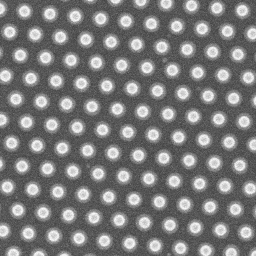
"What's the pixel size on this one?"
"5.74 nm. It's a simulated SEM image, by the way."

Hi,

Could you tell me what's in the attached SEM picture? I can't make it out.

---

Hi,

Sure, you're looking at an array of small figures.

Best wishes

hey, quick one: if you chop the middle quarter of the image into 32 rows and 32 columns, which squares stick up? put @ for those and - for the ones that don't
@@@---@@@@--@@@@@--@@@@--@@@@---
-------@@----@@@---@@@@--@@@@--@
-------------------@@@---@@@@--@
---@@@----@---------------@@----
--@@@@---@@@----@@--------------
--@@@@---@@@@--@@@@---@@@----@@-
---@@@---@@@---@@@@--@@@@---@@@@
----------@-----@@@--@@@@---@@@@
@@--------------------@@@---@@@-
@@@--@@@@---@@------------------
@@@--@@@@--@@@@---@@@-----------
@@---@@@@--@@@@---@@@@--@@@@---@
------@@----@@@---@@@@--@@@@--@@
------------------@@@---@@@@--@@
--@@@----@---------------@@----@
-@@@@---@@@----@@---------------
-@@@@---@@@@--@@@@---@@@----@---
--@@@---@@@---@@@@--@@@@---@@@@-
--------------@@@@--@@@@---@@@@-
@--------------------@@----@@@--
@@--@@@@---@@-------------------
@@--@@@@--@@@@---@@@----@-------
@---@@@@--@@@@---@@@@--@@@@---@@
-----@@----@@@---@@@@--@@@@--@@@
-----------------@@@---@@@@--@@@
-@@@----@---------------@@----@@
@@@@---@@@---@@@----------------
@@@@---@@@@--@@@@---@@@----@@---
-@@@---@@@---@@@@--@@@@---@@@@--
-------------@@@---@@@@---@@@@--
--------------------@@----@@@---
@--@@@@---@@--------------------